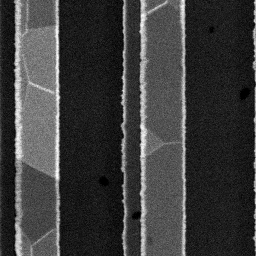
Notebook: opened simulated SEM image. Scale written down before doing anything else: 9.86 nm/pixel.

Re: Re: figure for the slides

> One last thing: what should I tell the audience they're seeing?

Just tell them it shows lines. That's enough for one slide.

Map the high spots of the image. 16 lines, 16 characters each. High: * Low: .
.***.....***....
.***.....***....
.***.....***....
.***.....***....
.***.....***....
.***.....***....
.***.....***....
.***.....***....
.***.....***....
.***.....***....
.***.....***....
.***.....***....
.***.....***....
.***.....***....
.***.....***....
.***.....***....